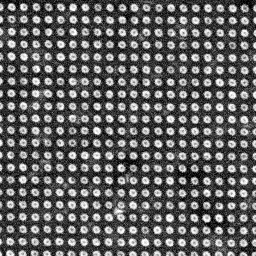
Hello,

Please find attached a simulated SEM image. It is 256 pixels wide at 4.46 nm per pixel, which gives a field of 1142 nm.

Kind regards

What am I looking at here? a regular array of raised bodies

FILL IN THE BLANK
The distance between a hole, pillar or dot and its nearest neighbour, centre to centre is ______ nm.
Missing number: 53.1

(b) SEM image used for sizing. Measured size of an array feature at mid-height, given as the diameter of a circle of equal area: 6.08 px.